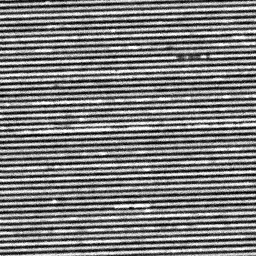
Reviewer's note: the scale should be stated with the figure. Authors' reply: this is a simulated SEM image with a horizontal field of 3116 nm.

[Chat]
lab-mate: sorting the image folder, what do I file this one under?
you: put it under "parallel lines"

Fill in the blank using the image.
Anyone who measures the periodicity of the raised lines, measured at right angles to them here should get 71.2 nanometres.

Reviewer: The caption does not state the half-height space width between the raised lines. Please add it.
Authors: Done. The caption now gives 44.1 nanometers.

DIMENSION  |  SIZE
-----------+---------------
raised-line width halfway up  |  2.75 pixels